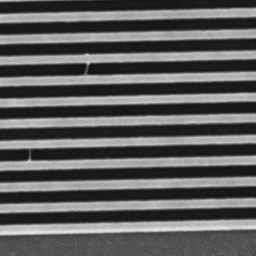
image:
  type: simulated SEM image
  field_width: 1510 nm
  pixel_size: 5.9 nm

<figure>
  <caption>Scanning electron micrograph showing parallel lines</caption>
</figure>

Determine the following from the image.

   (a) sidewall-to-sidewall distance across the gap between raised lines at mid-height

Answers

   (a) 0.0685 microns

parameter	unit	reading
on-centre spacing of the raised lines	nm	124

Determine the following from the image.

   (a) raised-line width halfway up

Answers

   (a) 0.0575 µm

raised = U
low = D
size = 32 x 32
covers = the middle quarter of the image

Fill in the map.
DDDDDDDDDDDDDDDDDDDDDDDDDDDDDDDD
DDDDDDDDDDDDDDDDDDDDDDDDDDDDDDDD
DDDDDDDDDDDDDDDDDDDUUUUUUUUUUUUU
UUUUUUUUUUUUUUUUUUUUUUUUUUUUUUUU
UUUUUUUUUUUUUUUUUUUUUUUUUUUUDDDD
DDDDDDDDDDDDDDDDDDDDDDDDDDDDDDDD
DDDDDDDDDDDDDDDDDDDDDDDDDDDDDDDD
DDDDDDDDDDDDDDDDDDDDDDDDDDDDDDDD
UUUUUUUUUUUUUUUUUUUUUUUUUUUUUUUU
UUUUUUUUUUUUUUUUUUUUUUUUUUUUUUUU
DDDDDDDDDDDDDDDDDDDDDDDDDDDDDDDD
DDDDDDDDDDDDDDDDDDDDDDDDDDDDDDDD
DDDDDDDDDDDDDDDDDDDDDDDDDDDDDDDD
UUUUUUUUUUUUUUUUUUUUUUUUUUUUUUUU
UUUUUUUUUUUUUUUUUUUUUUUUUUUUUUUU
UUUUUDDUDDDDDDDDDDDDDDDDDDDDDDDD
DDDDDDDDDDDDDDDDDDDDDDDDDDDDDDDD
DDDDDDDDDDDDDDDDDDDDDDDDDDDDDDDD
DDDDDDDDDDUDDUDDDUUUUUUUUUUUUUUU
UUUUUUUUUUUUUUUUUUUUUUUUUUUUUUUU
UUUUUUUUUUUUUUUUUUUDDDDDDDDDDDDD
DDDDDDDDDDDDDDDDDDDDDDDDDDDDDDDD
DDDDDDDDDDDDDDDDDDDDDDDDDDDDDDDD
DDDDDDDDDDDDDDDDDDDDDDDDUUUUUUUU
UUUUUUUUUUUUUUUUUUUUUUUUUUUUUUUU
UUUUUUUUUUUUUUUUUUUUUUUUUUUUUUUU
DDDDDDDDDDDDDDDDDDDDDDDDDDDDDDDD
DDDDDDDDDDDDDDDDDDDDDDDDDDDDDDDD
DDDDDDDDDDDDDDDDDDDDDDDDDDDDDDDD
UUUUUUUUUUUUUUUUUUUUUUUUUUUUUUUU
UUUUUUUUUUUUUUUUUUUUUUUUUUUUUUUU
UUUUUDDDDDDDDDDDDDDDDDDDDDDDDDDD